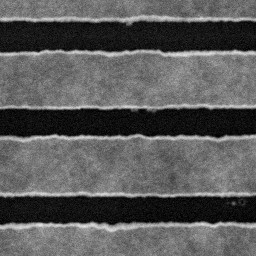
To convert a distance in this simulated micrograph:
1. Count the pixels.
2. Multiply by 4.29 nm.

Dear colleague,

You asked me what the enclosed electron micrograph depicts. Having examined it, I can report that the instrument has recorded lines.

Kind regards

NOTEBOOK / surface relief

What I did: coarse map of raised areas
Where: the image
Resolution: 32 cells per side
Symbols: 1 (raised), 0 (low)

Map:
11111111111111111111111111111111
11111111111111111111111111111111
10011111011111111000000110111101
00000000000000000000000000000000
00000000000000000000000000000000
00000000000000000000000000000000
00000111111010011111000000000100
11111111111111111111111111111111
11111111111111111111111111111111
11111111111111111111111111111111
11111111111111111111111111111111
11111111111111111111111111111111
11111111111111111111111111111111
10111111111011111111100000000000
00000000000000000000000000000000
00000000000000000000000000000000
00000000000000000000000000000000
11111111111111111111111111111111
11111111111111111111111111111111
11111111111111111111111111111111
11111111111111111111111111111111
11111111111111111111111111111111
11111111111111111111111111111111
11111111111111111111111111111111
00000000000000001111111000000000
00000000000000000000000000000000
00000000000000000000000000000000
00000000000000000000000000000000
11111111111111111111111111111111
11111111111111111111111111111111
11111111111111111111111111111111
11111111111111111111111111111111